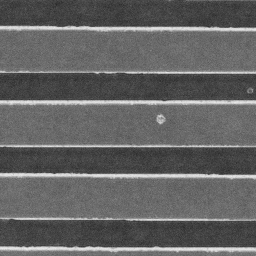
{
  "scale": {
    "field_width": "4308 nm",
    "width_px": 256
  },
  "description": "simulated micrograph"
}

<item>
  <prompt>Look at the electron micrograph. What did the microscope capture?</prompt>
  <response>lines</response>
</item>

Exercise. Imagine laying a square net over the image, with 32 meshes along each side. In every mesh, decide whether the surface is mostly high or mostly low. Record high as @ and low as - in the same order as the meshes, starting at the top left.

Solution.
--------------------------------
--------------------------------
--------------------------------
@@@@@@@@@@@@@@@@@@@-@@----------
@@@@@@@@@@@@@@@@@@@@@@@@@@@@@@@@
@@@@@@@@@@@@@@@@@@@@@@@@@@@@@@@@
@@@@@@@@@@@@@@@@@@@@@@@@@@@@@@@@
@@@@@@@@@@@@@@@@@@@@@@@@@@@@@@@@
@@@@@@@@@@@@@@@@@@@@@@@@@@@@@@@@
--------------------------------
--------------------------------
--------------------------------
--------------------------------
@@@@@@@@@@@@@@@@@@@@@@@@@@@@@@@@
@@@@@@@@@@@@@@@@@@@@@@@@@@@@@@@@
@@@@@@@@@@@@@@@@@@@@@@@@@@@@@@@@
@@@@@@@@@@@@@@@@@@@@@@@@@@@@@@@@
@@@@@@@@@@@@@@@@@@@@@@@@@@@@@@@@
--------------------------------
--------------------------------
--------------------------------
--------------------------------
@@@@@@@@@@@@@@@@@@@@@@@@@@@@@@@@
@@@@@@@@@@@@@@@@@@@@@@@@@@@@@@@@
@@@@@@@@@@@@@@@@@@@@@@@@@@@@@@@@
@@@@@@@@@@@@@@@@@@@@@@@@@@@@@@@@
@@@@@@@@@@@@@@@@@@@@@@@@@@@@@@@@
--------------------------------
--------------------------------
--------------------------------
--------------------------------
@@@@@@@@@@@@@@@@@@@@@@@@@@@@@@@@